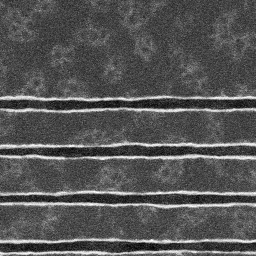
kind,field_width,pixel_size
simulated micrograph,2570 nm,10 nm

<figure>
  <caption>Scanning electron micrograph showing parallel lines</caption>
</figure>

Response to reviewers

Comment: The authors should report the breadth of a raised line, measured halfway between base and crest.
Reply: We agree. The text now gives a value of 369 nanometers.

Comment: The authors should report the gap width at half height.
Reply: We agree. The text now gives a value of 110 nm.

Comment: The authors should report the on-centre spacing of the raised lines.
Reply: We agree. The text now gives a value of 476 nm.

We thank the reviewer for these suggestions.